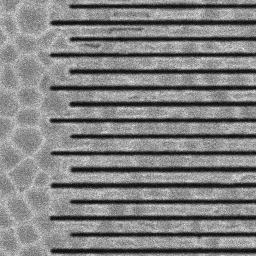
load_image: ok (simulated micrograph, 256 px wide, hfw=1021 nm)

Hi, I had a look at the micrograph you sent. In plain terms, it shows parallel lines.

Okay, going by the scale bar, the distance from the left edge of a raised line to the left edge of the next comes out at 65.1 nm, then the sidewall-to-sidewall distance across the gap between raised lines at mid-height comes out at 16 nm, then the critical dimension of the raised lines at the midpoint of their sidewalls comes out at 47.4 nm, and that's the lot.